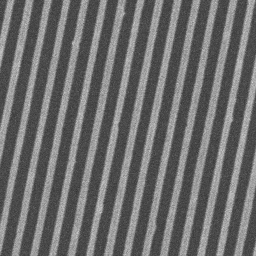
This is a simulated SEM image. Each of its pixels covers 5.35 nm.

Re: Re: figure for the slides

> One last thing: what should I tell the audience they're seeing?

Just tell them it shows parallel lines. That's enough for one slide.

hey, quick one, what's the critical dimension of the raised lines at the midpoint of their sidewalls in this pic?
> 0.0322 um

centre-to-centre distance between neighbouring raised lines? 97.4 nanometers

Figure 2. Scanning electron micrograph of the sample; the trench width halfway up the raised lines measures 64.2 nm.